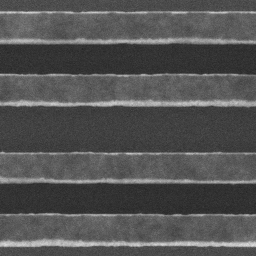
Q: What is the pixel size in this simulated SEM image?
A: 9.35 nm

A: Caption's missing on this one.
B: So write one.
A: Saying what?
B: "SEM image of lines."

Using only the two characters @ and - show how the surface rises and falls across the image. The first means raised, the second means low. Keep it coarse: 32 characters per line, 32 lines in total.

--------------------------------
--------------------------------
@@@@@@@@@@@@@@@@@@@@@@@@@@@@@@@@
@@@@@@@@@@@@@@@@@@@@@@@@@@@@@@@@
@@@@@@@@@@@@@@@@@@@@@@@@@@@@@@@@
--------------------------------
--------------------------------
--------------------------------
--------------------------------
@@@@@@@@@@@@@@@@@@@@@@@@@@@@@@@@
@@@@@@@@@@@@@@@@@@@@@@@@@@@@@@@@
@@@@@@@@@@@@@@@@@@@@@@@@@@@@@@@@
@@@@@@@@@@@@@@@@@@@@@@@@@@@@@@@@
--------------------------------
--------------------------------
--------------------------------
--------------------------------
--------------------------------
--------------------------------
@@@@@@@@@@@@@@@@@@@@@@@@@@@@@@@@
@@@@@@@@@@@@@@@@@@@@@@@@@@@@@@@@
@@@@@@@@@@@@@@@@@@@@@@@@@@@@@@@@
@@@@@@@@@@@@@@@@@@@@@@@@@@@@@@@@
--------------------------------
--------------------------------
--------------------------------
--------------------------------
@@@@@@@@@@@@@@@@@@@@@@@@@@@@@@@@
@@@@@@@@@@@@@@@@@@@@@@@@@@@@@@@@
@@@@@@@@@@@@@@@@@@@@@@@@@@@@@@@@
@@@@@@@@@@@@@@@@@@@@@@@@@@@@@@@@
--------------------------------